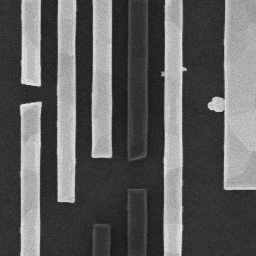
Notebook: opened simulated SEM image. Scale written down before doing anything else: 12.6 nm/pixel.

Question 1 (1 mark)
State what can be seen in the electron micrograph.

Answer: wiring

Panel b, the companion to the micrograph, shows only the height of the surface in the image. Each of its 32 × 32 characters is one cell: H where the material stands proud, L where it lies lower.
LLLHHLLHHLLLHHLLHHLLLHHLLLLLHHHH
LLLHHLLHHLLLHHLLHHLLLHHLLLLLHHHH
LLLHHLLHHLLLHHLLHHLLLHHLLLLLHHHH
LLLHHLLHHLLLHHLLHHLLLHHLLLLLHHHH
LLLHHLLHHLLLHHLLHHLLLHHLLLLLHHHH
LLLHHLLHHLLLHHLLHHLLLHHLLLLLHHHH
LLLHHLLHHLLLHHLLHHLLLHHLLLLLHHHH
LLLHHLLHHLLLHHLLHHLLLHHLLLLLHHHH
LLLHHLLHHLLLHHLLHHLLLHHLLLLLHHHH
LLLHHLLHHLLLHHLLHHLLLHHLLLLLHHHH
LLLHHLLHHLLLHHLLHHLLLHHLLLLLHHHH
LLLLLLLHHLLLHHLLHHLLLHHLLLLLHHHH
LLLLLLLHHLLLHHLLHHLLLHHLLLLLHHHH
LLLHHLLHHLLLHHLLHHLLLHHLLLLHHHHH
LLLHHLLHHLLLHHLLHHLLLHHLLLLLHHHH
LLLHHLLHHLLLHHLLHHLLLHHLLLLLHHHH
LLLHHLLHHLLLHHLLHHLLLHHLLLLLHHHH
LLLHHLLHHLLLHHLLHHLLLHHLLLLLHHHH
LLLHHLLHHLLLHHLLHHLLLHHLLLLLHHHH
LLLHHLLHHLLLHHLLHHLLLHHLLLLLHHHH
LLLHHLLHHLLLLLLLLLLLLHHLLLLLHHHH
LLLHHLLHHLLLLLLLLLLLLHHLLLLLHHHH
LLLHHLLHHLLLLLLLLLLLLHHLLLLLHHHH
LLLHHLLHHLLLLLLLLLLLLHHLLLLLHHHH
LLLHHLLHHLLLLLLLHHLLLHHLLLLLLLLL
LLLHHLLLLLLLLLLLHHLLLHHLLLLLLLLL
LLLHHLLLLLLLLLLLHHLLLHHLLLLLLLLL
LLLHHLLLLLLLLLLLHHLLLHHLLLLLLLLL
LLLHHLLLLLLLHHLLHHLLLHHLLLLLLLLL
LLLHHLLLLLLLHHLLHHLLLHHLLLLLLLLL
LLLHHLLLLLLLHHLLHHLLLHHLLLLLLLLL
LLLHHLLLLLLLHHLLHHLLLHHLLLLLLLLL